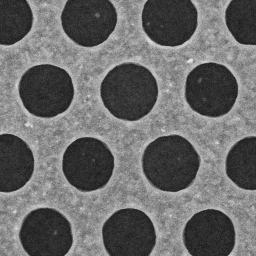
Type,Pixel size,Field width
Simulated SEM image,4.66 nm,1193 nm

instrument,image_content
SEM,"holes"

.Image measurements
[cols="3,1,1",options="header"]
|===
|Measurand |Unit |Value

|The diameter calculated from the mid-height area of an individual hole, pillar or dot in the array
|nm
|254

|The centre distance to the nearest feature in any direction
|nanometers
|386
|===